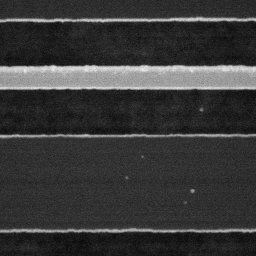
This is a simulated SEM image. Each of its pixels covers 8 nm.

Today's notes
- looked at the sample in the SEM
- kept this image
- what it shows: lines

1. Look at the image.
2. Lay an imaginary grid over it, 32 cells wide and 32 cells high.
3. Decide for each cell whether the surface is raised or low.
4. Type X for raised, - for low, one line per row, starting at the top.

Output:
XXXXXXXXXXXXXXXXXXXXXXXXXXXXXXXX
XXXXXXXXXXXXXXXXXXXXXXXXXXXXXXXX
XX--XXXXXXXXXX--XXX-------------
--------------------------------
--------------------------------
--------------------------------
--------------------------------
--------------------------------
--X--XXXXXXXXXXXXXXXXXXXXXXXXXXX
XXXXXXXXXXXXXXXXXXXXXXXXXXXXXXXX
XXXXXXXXXXXXXXXXXXXXXXXXXXXXXXXX
--------------------------------
--------------------------------
--------------------------------
--------------------------------
--------------------------------
--------------------------------
XXXXXXXXXXXXXXXXXXXXXXXXXXXXXXXX
XXXXXXXXXXXXXXXXXXXXXXXXXXXXXXXX
XXXXXXXXXXXXXXXXXXXXXXXXXXXXXXXX
XXXXXXXXXXXXXXXXXXXXXXXXXXXXXXXX
XXXXXXXXXXXXXXXXXXXXXXXXXXXXXXXX
XXXXXXXXXXXXXXXXXXXXXXXXXXXXXXXX
XXXXXXXXXXXXXXXXXXXXXXXXXXXXXXXX
XXXXXXXXXXXXXXXXXXXXXXXXXXXXXXXX
XXXXXXXXXXXXXXXXXXXXXXXXXXXXXXXX
XXXXXXXXXXXXXXXXXXXXXXXXXXXXXXXX
XXXXXXXXXXXXXXXXXXXXXXXXXXXXXXXX
XXXXXXXXXXXXXXXXXXXXXXXXXXXXXXXX
--------------------------------
--------------------------------
--------------------------------